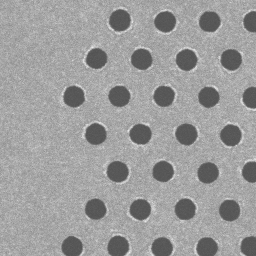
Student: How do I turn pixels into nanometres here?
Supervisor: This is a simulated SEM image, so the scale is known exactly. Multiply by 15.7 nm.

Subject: a regular array of holes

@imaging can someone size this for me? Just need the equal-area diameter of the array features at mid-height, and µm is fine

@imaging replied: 0.34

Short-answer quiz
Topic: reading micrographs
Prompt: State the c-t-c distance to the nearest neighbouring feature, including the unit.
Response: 680 nanometers